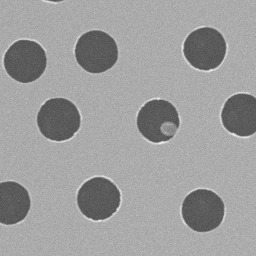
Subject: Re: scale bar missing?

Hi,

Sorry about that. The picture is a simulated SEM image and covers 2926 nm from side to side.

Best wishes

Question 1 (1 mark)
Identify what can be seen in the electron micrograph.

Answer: holes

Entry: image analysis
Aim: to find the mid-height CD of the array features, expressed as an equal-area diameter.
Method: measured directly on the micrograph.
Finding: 494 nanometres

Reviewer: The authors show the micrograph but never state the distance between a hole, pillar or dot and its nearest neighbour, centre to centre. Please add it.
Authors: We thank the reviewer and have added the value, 86.1 px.